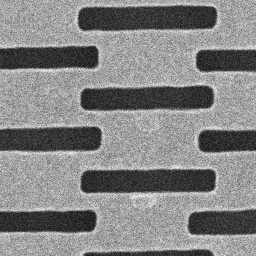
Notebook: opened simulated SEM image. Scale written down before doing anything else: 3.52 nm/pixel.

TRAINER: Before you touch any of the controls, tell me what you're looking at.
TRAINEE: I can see holes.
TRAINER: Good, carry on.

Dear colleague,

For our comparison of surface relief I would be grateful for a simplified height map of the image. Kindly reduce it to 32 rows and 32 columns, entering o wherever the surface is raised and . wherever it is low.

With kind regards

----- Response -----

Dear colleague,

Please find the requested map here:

oooooooooooooooooooooooooooooooo
oooooooooo.................ooooo
oooooooooo.................ooooo
oooooooooo................oooooo
oooooooooooooooooooooooooooooooo
oooooooooooooooooooooooooooooooo
............ooooooooooooo.......
............oooooooooooo........
...........oooooooooooooo.......
oooooooooooooooooooooooooooooooo
oooooooooooooooooooooooooooooooo
oooooooooo.................ooooo
oooooooooo.................ooooo
oooooooooo................oooooo
oooooooooooooooooooooooooooooooo
oooooooooooooooooooooooooooooooo
.............oooooooooooo.......
.............oooooooooooo.......
............ooooooooooooo.......
oooooooooooooooooooooooooooooooo
oooooooooooooooooooooooooooooooo
ooooooooooo................ooooo
oooooooooo.................ooooo
oooooooooo.................ooooo
oooooooooooooooooooooooooooooooo
oooooooooooooooooooooooooooooooo
............ooooooooooooo.......
............oooooooooooo........
............ooooooooooo.........
oooooooooooooooooooooooooooooooo
oooooooooooooooooooooooooooooooo
ooooooooooo.o.............oooooo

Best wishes